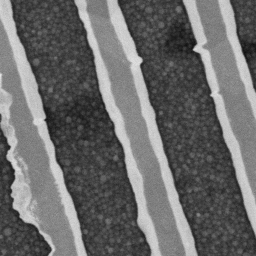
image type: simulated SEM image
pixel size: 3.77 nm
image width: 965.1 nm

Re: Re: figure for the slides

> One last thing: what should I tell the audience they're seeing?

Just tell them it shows one or a few lines or trenches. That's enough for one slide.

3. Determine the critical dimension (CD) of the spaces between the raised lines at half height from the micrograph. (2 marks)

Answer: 0.272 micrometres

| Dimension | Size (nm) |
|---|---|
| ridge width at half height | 123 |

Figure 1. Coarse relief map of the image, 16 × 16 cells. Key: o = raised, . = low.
.....oo.....oo..
o....ooo....oo..
o.....oo....ooo.
o.....oo.....oo.
oo....ooo....oo.
oo.....oo....ooo
oo.....oo.....oo
oo.....oo.....oo
.oo.....oo....oo
.oo.....oo.....o
.oo.....oo.....o
.ooo.....oo....o
.ooo.....oo.....
..oo.....oo.....
...oo....oo.....
...oo.....oo....